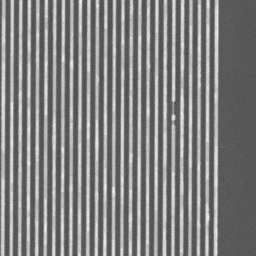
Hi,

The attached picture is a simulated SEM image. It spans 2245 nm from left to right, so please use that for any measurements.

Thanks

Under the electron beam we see parallel lines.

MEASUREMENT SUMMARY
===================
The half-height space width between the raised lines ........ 52.6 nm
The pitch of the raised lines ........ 74.7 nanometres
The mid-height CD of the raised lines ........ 0.0263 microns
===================